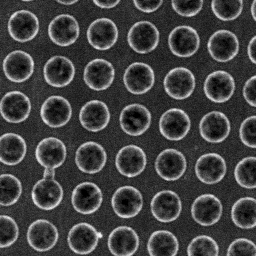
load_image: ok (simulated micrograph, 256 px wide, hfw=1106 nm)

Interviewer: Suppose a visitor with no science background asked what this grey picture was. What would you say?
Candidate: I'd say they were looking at a regular array of raised bodies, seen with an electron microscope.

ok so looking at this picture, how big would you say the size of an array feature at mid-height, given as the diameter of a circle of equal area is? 127 nm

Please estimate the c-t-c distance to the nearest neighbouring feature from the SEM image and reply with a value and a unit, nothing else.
0.173 micrometres